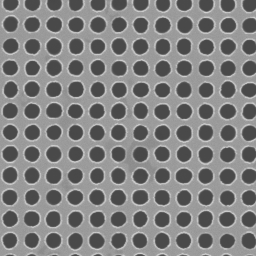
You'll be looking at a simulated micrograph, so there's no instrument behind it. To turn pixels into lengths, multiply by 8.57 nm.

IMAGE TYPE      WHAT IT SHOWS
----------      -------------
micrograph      a regular array of holes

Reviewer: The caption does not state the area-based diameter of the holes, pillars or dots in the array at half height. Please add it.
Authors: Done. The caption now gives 14.9 px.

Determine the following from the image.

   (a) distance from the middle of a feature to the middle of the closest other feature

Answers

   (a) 182 nm